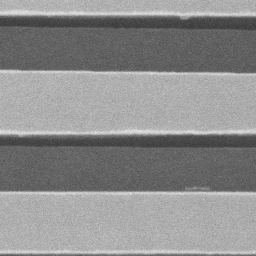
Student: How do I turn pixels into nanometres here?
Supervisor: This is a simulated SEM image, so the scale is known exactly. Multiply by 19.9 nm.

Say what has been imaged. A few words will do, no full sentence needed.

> lines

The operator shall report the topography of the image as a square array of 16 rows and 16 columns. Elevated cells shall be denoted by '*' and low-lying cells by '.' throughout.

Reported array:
****************
................
................
................
******..........
****************
****************
****************
................
................
................
................
****************
****************
****************
****************